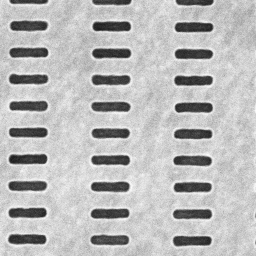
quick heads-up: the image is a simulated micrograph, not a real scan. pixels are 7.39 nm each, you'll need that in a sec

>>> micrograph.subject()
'a regular array of holes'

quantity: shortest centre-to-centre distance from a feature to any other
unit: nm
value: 197